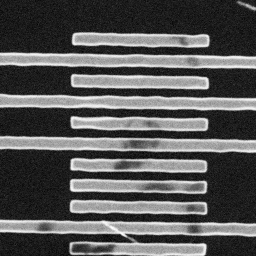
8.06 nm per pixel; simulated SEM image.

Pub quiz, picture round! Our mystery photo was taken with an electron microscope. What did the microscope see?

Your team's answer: groups of lines, slits or small figures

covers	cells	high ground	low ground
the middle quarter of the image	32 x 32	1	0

01110011111111101100111111111111
00000000000000000000000000000000
00000000000000000000000000000000
00111111111111111111111111111111
00111111111111111111111111111111
00111111111111111111111111111111
00000000000000000000000000000000
00000000000000000000000000000000
11111111111111111111111111111111
11111111111111111111111111111111
11111011111111111111111111111111
00000000000000000000000000000000
00000000000000000000000000000000
00100000000000011111000000000000
00111111111111111111111111111111
00111111111111111111111111111111
00000000000000000000000001111111
00000000000000000000000000000000
00000000000000000000000000000000
11111111111111111111111111111111
11111111111111111111111111111111
00000000000000110000111111111111
00000000000000000000000000000000
00000000000000000000000000000000
00111111111111111111111111111111
00111111111111111111111111111111
00001111111111111111111111111111
00000000000000000000000000000000
00000000000000000000000000000000
00111111111111111111111111111111
00111111111111111111111111111111
00111111111111111111111111111111